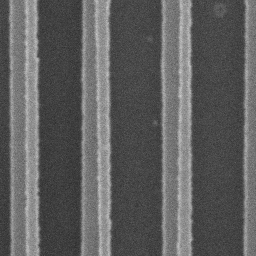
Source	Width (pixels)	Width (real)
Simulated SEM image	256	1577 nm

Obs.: lines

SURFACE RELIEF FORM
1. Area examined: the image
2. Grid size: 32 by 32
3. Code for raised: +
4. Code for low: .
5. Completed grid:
.++++.....++++......++++.......+
.++++.....++++......++++.......+
.++++.....++++......++++.......+
.++++.....++++......++++.......+
.++++.....++++......++++.......+
.++++.....++++......++++.......+
.++++.....++++......++++.......+
.++++.....++++......++++.......+
.++++.....++++......++++.......+
.++++.....++++......++++.......+
.++++.....++++......++++.......+
.++++.....++++......++++.......+
.++++.....++++......++++.......+
.++++.....++++......++++.......+
.++++.....++++......++++.......+
.++++.....++++......++++.......+
.++++.....++++......++++.......+
.++++.....++++.......+++.......+
.++++.....++++......++++.......+
.++++.....++++......++++.......+
.++++.....++++......++++.......+
.++++.....++++......++++.......+
.++++.....++++......++++.......+
.++++.....++++......++++.......+
.++++.....++++......++++.......+
.++++.....++++......++++.......+
.++++.....++++......++++.......+
.++++.....++++......++++.......+
.++++.....++++......++++.......+
.++++.....++++.......+++.......+
.++++.....++++.......+++.......+
.++++.....++++......++++.......+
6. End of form